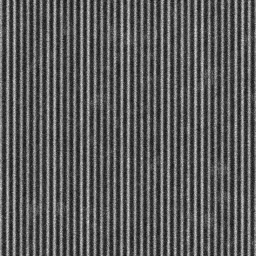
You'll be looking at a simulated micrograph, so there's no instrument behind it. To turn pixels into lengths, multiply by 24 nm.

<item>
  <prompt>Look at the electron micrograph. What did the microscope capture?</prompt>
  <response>parallel lines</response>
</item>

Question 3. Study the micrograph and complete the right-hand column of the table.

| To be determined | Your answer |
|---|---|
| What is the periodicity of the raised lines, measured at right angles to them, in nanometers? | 161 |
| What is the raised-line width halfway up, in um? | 0.0449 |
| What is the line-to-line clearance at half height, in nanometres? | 114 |